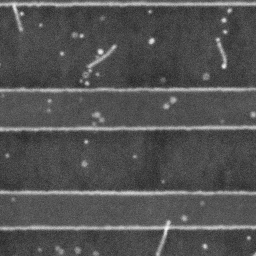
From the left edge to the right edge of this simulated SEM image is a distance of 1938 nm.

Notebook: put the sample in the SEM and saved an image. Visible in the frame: lines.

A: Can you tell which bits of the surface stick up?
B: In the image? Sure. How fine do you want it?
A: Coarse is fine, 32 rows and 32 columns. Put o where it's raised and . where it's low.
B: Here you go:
oooooooooooooooooooooooooooooooo
................................
................................
................................
................................
................................
................................
................................
................................
................................
................................
oooooooooooooooooooooooooooooooo
oooooooooooooooooooooooooooooooo
oooooooooooooooooooooooooooooooo
oooooooooooooooooooooooooooooooo
oooooooooooooooooooooooooooooooo
................................
................................
................................
................................
................................
................................
................................
................................
oooooooooooooooooooooooooooooooo
oooooooooooooooooooooooooooooooo
oooooooooooooooooooooooooooooooo
oooooooooooooooooooooooooooooooo
ooooooooooooooooooo.o...o.o.....
................................
................................
................................